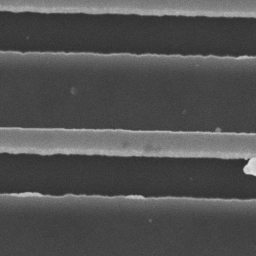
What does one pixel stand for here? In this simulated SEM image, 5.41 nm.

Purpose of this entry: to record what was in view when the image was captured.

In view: lines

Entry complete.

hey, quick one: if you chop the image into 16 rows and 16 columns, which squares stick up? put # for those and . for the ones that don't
################
................
................
###########.....
################
################
################
################
################
################
...............#
................
##############..
################
################
################